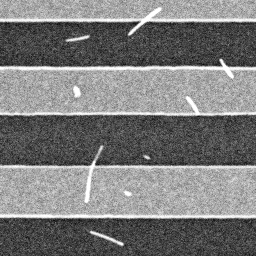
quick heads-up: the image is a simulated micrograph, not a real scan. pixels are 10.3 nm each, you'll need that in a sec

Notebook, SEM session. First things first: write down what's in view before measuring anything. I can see lines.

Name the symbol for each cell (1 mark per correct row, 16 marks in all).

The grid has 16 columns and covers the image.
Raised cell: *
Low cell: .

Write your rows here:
****************
................
................
................
****************
****************
****************
................
................
................
****************
****************
****************
****************
................
................